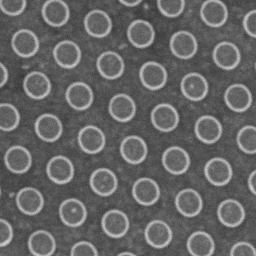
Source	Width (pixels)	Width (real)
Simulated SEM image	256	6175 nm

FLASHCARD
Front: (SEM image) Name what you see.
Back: a regular array of raised bodies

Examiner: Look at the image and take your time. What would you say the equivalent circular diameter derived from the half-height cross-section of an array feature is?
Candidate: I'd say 25.5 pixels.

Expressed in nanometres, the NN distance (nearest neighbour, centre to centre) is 1040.